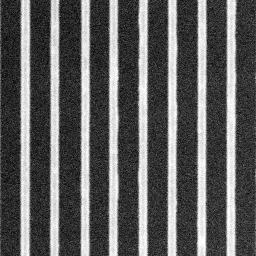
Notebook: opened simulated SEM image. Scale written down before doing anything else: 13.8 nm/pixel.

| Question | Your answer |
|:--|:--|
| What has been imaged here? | parallel lines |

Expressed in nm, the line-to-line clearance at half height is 325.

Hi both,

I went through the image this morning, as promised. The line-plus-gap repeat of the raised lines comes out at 405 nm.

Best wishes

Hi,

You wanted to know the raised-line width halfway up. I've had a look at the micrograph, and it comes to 84.3 nm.